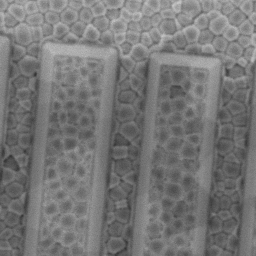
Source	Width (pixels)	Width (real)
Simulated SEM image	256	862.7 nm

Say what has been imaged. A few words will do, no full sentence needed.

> one or a few lines or trenches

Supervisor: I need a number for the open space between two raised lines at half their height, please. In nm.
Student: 152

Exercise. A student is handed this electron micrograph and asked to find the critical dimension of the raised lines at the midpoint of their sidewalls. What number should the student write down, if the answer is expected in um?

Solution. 0.207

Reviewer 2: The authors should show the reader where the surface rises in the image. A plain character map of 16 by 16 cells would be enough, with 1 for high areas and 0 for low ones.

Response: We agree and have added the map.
0000000000000000
0000000000000000
0000000000000000
0001111000000000
0001111000111000
0001111000111000
0001111001111000
0001111001111000
0001111001111000
0011110001111000
0011110001111000
0011110001111000
0011110001111000
0011110001111000
0011110001110001
0011110001110001